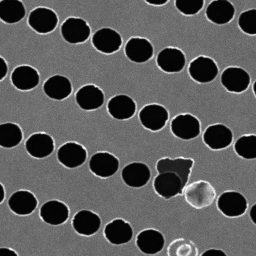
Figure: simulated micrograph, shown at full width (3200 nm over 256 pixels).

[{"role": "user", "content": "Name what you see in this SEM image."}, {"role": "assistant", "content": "a regular array of holes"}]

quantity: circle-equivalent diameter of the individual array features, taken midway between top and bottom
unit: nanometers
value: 325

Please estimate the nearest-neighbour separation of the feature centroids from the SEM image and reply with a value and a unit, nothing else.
416 nm